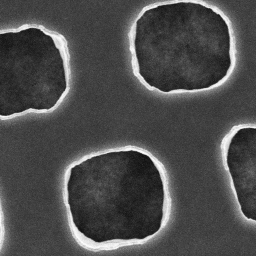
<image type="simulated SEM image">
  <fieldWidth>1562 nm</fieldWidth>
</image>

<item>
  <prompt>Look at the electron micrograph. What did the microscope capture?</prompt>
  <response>holes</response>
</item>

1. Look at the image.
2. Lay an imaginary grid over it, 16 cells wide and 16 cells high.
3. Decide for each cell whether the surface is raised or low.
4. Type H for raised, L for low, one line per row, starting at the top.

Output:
HHHHHHHHHHLLLHHH
HHHHHHHHLLLLLLHH
LLLHHHHHLLLLLLHH
LLLLHHHHLLLLLLHH
LLLLHHHHHLLLLLHH
LLLLHHHHHHLLLHHH
LLLHHHHHHHHHHHHH
HHHHHHHHHHHHHHHH
HHHHHHHHHHHHHHHL
HHHHHHHLLHHHHHLL
HHHHHLLLLLHHHHLL
HHHHLLLLLLHHHHHL
HHHHLLLLLLHHHHHL
HHHHLLLLLLHHHHHL
HHHHHLLLLLHHHHHH
HHHHHHHHHHHHHHHH